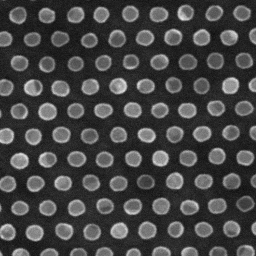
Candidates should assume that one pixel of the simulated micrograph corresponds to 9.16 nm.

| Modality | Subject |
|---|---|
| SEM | a regular array of raised bodies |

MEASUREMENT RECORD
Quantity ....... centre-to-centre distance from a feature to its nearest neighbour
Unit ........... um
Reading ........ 0.246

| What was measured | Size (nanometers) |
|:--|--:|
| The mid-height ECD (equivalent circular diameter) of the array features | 145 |